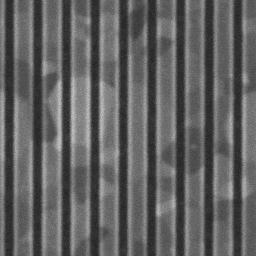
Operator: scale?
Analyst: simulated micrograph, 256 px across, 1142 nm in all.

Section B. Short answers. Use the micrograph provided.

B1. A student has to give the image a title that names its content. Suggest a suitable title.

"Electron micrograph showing parallel lines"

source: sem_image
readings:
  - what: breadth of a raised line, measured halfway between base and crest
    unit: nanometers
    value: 73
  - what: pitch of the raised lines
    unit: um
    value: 0.127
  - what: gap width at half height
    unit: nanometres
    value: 55.2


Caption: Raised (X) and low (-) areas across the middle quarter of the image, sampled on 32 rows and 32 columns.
--XXXX---XXXX---XXXX----XXXX---X
--XXXX---XXXX---XXXX----XXXX---X
--XXXX---XXXX---XXXX----XXXX---X
--XXXX---XXXX---XXXX----XXXX---X
--XXXX---XXXX---XXXX----XXXX---X
--XXXX---XXXX---XXXX----XXXX---X
--XXXX---XXXX---XXXX----XXXX---X
--XXXX---XXXX---XXXX----XXXX---X
--XXXX---XXXX---XXXX----XXXX---X
--XXXX---XXXX---XXXX----XXXX---X
--XXXX---XXXX---XXXX----XXXX---X
--XXXX---XXXX---XXXX----XXXX---X
--XXXX---XXXX---XXXX----XXXX---X
--XXXX---XXXX---XXXX----XXXX---X
--XXXX---XXXX---XXXX---XXXXX---X
--XXXX---XXXX---XXXX----XXXX---X
--XXXX---XXXX---XXXX----XXXX---X
--XXXX---XXXX---XXXX----XXXX---X
--XXXX---XXXX---XXXX----XXXX---X
--XXXX---XXXX---XXXX----XXXX---X
--XXXX---XXXX---XXXX----XXXX---X
--XXXX---XXXX---XXXX----XXXX---X
--XXXX---XXXX---XXXX----XXXX---X
--XXXX---XXXX---XXXX----XXXX---X
--XXXX---XXXX---XXXX----XXXX---X
--XXXX---XXXX---XXXX----XXXX---X
--XXXX---XXXX---XXXX----XXXX---X
--XXXX---XXXX---XXXX----XXXX---X
--XXXX---XXXX---XXXX----XXXX---X
--XXXX---XXXX---XXXX----XXXX---X
--XXXX---XXXX---XXXX----XXXX---X
--XXXX---XXXX---XXXX----XXXX---X